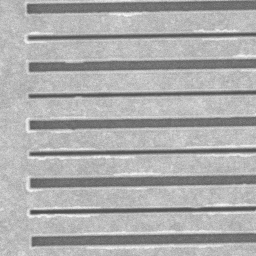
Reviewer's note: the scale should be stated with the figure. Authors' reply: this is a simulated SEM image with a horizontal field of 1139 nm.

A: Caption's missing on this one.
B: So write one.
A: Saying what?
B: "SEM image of parallel lines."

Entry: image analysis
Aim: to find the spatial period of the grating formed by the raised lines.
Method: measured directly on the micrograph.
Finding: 127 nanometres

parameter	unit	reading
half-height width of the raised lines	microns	0.0928